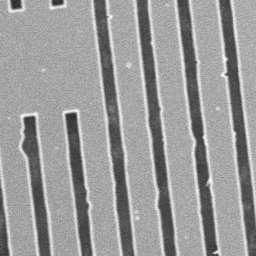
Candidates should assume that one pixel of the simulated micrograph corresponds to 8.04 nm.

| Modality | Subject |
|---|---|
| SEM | parallel lines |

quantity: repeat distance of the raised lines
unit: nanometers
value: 333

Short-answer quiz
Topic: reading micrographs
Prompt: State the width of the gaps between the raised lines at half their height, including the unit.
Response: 0.105 um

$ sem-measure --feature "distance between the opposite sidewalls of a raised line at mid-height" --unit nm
231